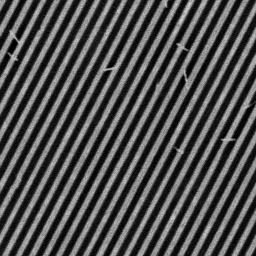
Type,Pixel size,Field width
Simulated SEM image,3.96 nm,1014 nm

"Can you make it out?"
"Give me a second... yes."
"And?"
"parallel lines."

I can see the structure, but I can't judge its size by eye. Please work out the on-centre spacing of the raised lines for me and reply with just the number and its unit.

47.4 nanometers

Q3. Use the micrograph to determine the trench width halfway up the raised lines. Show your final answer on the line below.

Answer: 23.3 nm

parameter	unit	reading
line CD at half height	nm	23.8